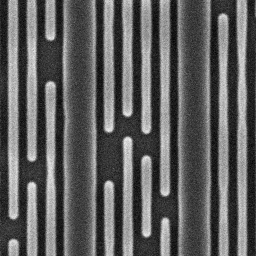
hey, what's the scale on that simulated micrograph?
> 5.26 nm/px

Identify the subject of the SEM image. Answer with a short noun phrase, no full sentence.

groups of lines, slits or small figures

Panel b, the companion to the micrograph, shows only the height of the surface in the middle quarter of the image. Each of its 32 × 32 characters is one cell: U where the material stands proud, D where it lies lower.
UUUUUUUUDDUUDDDUUDDDUDDDUUDDDUUU
UUUUUUUUDDUUDDDUUDDDUDDDUUDDDUUU
UUUUUUUUDDUUDDDUUDDDUUDDUUDDDUUU
UUUUUUUUDDUUDDDUUDDDUUDDUUDDDUUU
UUUUUUUUDDUUDDDUUDDDUUDDUUDDDUUU
UUUUUUUUDDUUDDDUUDDDUUDDUUDDDUUU
UUUUUUUUDDUUDDDUUDDDUDDDUUDDDUUU
UUUUUUUUDDUUDDDUUDDDUDDDUUDDDUUU
UUUUUUUUDDUUDDDUUDDDUDDDUUDDDUUU
UUUUUUUUDDUUDDDUUDDDUDDDUUDDDUUU
UUUUUUUUDDUUDDDUUDDDUDDDUUDDDUUU
UUUUUUUUDDUUDDDUUDDDUUDDUUDDDUUU
UUUUUUUUDDUUDDDUUDDDUUDDUUDDDUUU
UUUUUUUUDDUUDDDDDDDDUUDDUUDDDUUU
DUUUUUUUDDUUDDDDDDDDUUDDUUDDDUUU
UUUUUUUUDDUUDDDDDDDDUUDDUUDDDUUU
UUUUUUUUDDDUDDDDDDDDUUDDUUDDDUUU
UUUUUUUUDDDDDDDDDDDDDDDDUUDDDUUU
UUUUUUUUDDDDDDDDDDDDDDDDUUDDDUUU
UUUUUUUUDDDDDDDUUDDDDDDDUUDDDUUU
UUUUUUUUDDDDDDDUUDDDDDDDUUDDDUUU
UUUUUUUUDDDDDDDUUDDDDDDDUUDDDUUU
UUUUUUUUDDDDDDDUUDDDDDDDUUDDDUUU
UUUUUUUUDDDDDDDUUDDDUDDDUUDDDUUU
UUUUUUUUDDDDDDDUUDDDUUDDUUDDDUUU
UUUUUUUUDDDDDDDUUDDDUUDDUUDDDUUU
UUUUUUUUDDDDDDDUUDDDUUDDUUDDDUUU
UUUUUUUUDDDDDDDUUDDDUUDDUUDDDUUU
UUUUUUUUDDDDDDDUUDDDUUDDUUDDDUUU
UUUUUUUUDDDUDDDUUDDDUUDDUUDDDUUU
UUUUUUUUDDUUDDDUUDDDUUDDUUDDDUUU
UUUUUUUUDDUUDDDUUDDDUUDDUUDDDUUU